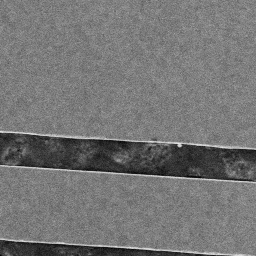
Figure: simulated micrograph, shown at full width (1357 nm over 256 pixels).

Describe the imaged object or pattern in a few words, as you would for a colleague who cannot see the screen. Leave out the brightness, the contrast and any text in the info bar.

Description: one or a few lines or trenches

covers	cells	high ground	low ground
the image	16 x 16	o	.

oooooooooooooooo
oooooooooooooooo
oooooooooooooooo
oooooooooooooooo
oooooooooooooooo
oooooooooooooooo
oooooooooooooooo
oooooooooooooooo
...ooooooooooooo
................
ooo.............
oooooooooooooooo
oooooooooooooooo
oooooooooooooooo
oooooooooooooooo
........oooooooo